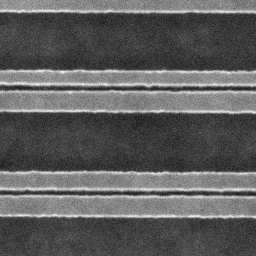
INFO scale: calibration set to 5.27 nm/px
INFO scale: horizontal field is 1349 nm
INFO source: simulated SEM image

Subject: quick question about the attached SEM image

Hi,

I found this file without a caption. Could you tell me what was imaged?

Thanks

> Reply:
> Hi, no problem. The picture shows lines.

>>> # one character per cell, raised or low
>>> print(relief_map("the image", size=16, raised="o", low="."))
oooooooooooooooo
................
................
................
oooooooooooooo.o
oooooooooooooooo
oooooooooooooooo
................
................
................
................
oooooooooooooooo
oooooooooooooooo
.....o..oooooooo
................
................